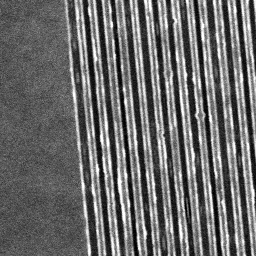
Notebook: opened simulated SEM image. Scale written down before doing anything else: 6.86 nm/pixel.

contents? parallel lines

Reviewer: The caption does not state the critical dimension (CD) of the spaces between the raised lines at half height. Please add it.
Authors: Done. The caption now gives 45.2 nm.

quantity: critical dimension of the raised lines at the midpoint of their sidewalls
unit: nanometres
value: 50.4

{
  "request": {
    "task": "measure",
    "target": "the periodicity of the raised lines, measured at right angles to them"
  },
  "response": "94.8 nm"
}